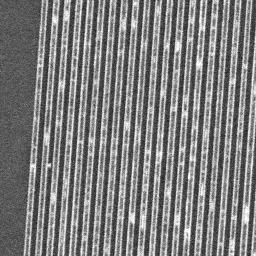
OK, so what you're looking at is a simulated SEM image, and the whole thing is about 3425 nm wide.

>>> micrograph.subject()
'parallel lines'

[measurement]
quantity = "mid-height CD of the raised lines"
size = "71.7 nm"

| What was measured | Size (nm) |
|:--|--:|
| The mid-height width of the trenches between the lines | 83.4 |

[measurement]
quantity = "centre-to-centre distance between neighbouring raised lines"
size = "152 nm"